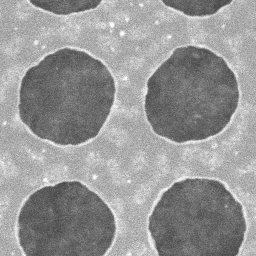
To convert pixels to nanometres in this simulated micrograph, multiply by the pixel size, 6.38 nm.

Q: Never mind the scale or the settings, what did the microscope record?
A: holes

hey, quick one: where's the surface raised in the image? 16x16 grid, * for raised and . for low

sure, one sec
**....*****...**
****************
****************
***...*****...**
**.....***.....*
*......**......*
*......**......*
*......**.....**
**....****...***
****************
****************
****.******...**
**....****.....*
*......**......*
*......**......*
*......***.....*